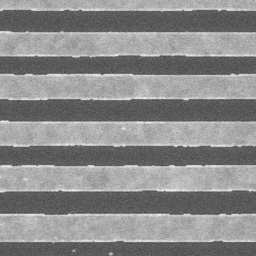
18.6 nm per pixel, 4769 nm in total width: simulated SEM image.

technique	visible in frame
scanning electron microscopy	lines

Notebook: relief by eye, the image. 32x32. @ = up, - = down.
@@@@@@@@@@@@@@@@@@@@@@@@@@@@@@@@
--------------------------------
--------------------------------
--------------------------------
@@@@@@@@@@@@@@@@@@@@@@@@@@@@@@@@
@@@@@@@@@@@@@@@@@@@@@@@@@@@@@@@@
@@@@@@@@@@@@@@@@@@@@@@@@@@@@@@@@
--------------------------------
--------------------------------
@@@@@@@@@@@@@@@@@@@@@@@@@@@@@@@@
@@@@@@@@@@@@@@@@@@@@@@@@@@@@@@@@
@@@@@@@@@@@@@@@@@@@@@@@@@@@@@@@@
--------------------------------
--------------------------------
--------------------------------
@@@@@@@@@@@@@@@@@@@@@@@@@@@@@@@@
@@@@@@@@@@@@@@@@@@@@@@@@@@@@@@@@
@@@@@@@@@@@@@@@@@@@@@@@@@@@@@@@@
--------------------------------
--------------------------------
--------------------------------
@@@@@@@@@@@@@@@@@@@@@@@@@@@@@@@@
@@@@@@@@@@@@@@@@@@@@@@@@@@@@@@@@
@@@@@@@@@@@@@@@@@@@@@@@@@@@@@@@@
--------------------------------
--------------------------------
--------------------------------
@@@@@@@@@@@@@@@@@@@@@@@@@@@@@@@@
@@@@@@@@@@@@@@@@@@@@@@@@@@@@@@@@
@@@@@@@@@@@@@@@@@@@@@@@@@@@@@@@@
--------------------------------
--------------------------------